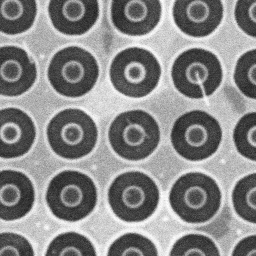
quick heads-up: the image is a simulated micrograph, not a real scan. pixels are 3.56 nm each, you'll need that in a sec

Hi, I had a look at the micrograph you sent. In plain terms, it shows an array of small figures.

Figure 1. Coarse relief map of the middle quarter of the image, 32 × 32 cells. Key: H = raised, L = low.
HHHHLLLLLHHLLLLLHHHLLLLLHHLLLLLH
HHHHHLLLLHHLLLLLHHHHLLLLLHLLLLLH
HHHHHLLLLHHLLLLLHHHHLLLLHHLLLLLH
HHHHLLLLLHHLLLLLHHHHLLLLHHHLLLLH
LHHLLLLLHHHLLLLLLLLLLLLLHHHLLLLL
LLLLLLLLHHHHLLLLLLLLLLLLHHHLLLLL
LLLLLLLHHHHHHLLLLLLLLLLHHHHHLLLL
LLLLLLHHHHHHHHLLLLLLLLHHHHHHHLLL
HLLLHHHHHHHHHHHHLLLLHHHHHHHHHHHL
HHHHHHHHHHHHHHHHHHHHHHHHHHHHHHHH
HHHHHHHHHHHHHHHHHHHHHHHHHHHHHHHH
LLLLLHHHHHHHHHHHLLLLHHHHHHHHHHHH
LLLLLLHHHHHHHLLLLLLLLLHHHHHHHHLL
LLLLLLLHHHHHLLLLLLLLLLLHHHHHLLLL
LLLLLLLLHHHHLLLLLLLLLLLHHHHLLLLL
HHHLLLLLHHHLLLLLHHHLLLLLHHHLLLLL
HHHHLLLLLHHLLLLHHHHHLLLLHHHLLLLH
HHHHLLLLLHHLLLLHHHHHLLLLHHLLLLLH
HHHHLLLLLHHLLLLHHHHHLLLLHHLLLLLH
LHHHLLLLLHHLLLLLHHHLLLLLHHLLLLLH
LLLLLLLLHHHLLLLLLLLLLLLLHHHLLLLL
LLLLLLLLHHHHLLLLLLLLLLLHHHHLLLLL
LLLLLLLHHHHHHLLLLLLLLLHHHHHHLLLL
LLLLLHHHHHHHHHLLLLLLLHHHHHHHHLLL
HHHHHHHHHHHHHHHHLLLHHHHHHHHHHHHL
HHHHHHHHHHHHHHHHHHHHHHHHHHHHHHHH
LLLLHHHHHHHHHHHLLLLHHHHHHHHHHHHH
LLLLLLHHHHHHHLLLLLLLLHHHHHHHHLLL
LLLLLLLHHHHHLLLLLLLLLLHHHHHHLLLL
LLLLLLLLHHHLLLLLLLLLLLLHHHHLLLLL
LHHLLLLLHHHLLLLLLLLLLLLLHHHLLLLL
HHHHLLLLLHLLLLLHHHHLLLLLHHLLLLLH